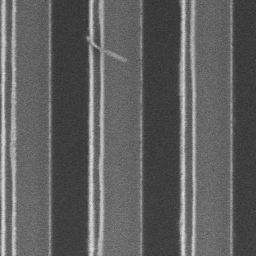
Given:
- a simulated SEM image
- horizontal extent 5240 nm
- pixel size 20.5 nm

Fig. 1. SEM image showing lines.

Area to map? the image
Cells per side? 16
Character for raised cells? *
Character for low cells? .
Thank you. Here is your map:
...***...**...**
...***...**...**
...***...**...**
...***...**...**
...***...**...**
...***...**...**
...***...**...**
...***...**...**
...***...**...**
...***...**...**
...***...**...**
...***...**...**
...***...**...**
...***...**...**
...***...**...**
...***...**...**